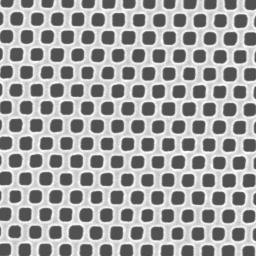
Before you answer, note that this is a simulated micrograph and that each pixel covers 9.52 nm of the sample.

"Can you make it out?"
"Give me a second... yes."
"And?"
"a regular array of holes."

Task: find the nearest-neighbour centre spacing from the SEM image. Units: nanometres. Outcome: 192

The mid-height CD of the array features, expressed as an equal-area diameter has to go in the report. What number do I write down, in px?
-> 14.5